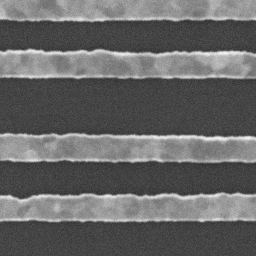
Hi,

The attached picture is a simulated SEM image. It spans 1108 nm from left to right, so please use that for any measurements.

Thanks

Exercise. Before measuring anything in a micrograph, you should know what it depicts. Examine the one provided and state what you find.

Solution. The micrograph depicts lines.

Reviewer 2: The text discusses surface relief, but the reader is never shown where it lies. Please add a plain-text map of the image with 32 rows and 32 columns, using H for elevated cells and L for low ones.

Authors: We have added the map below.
HHHHHHHHHHHHHHHHHHHHHHHHHHHHHHHH
HHHHHHHHHHHHHHHHHHHHHHHHHHHHHHHH
LLHHHLHHHHHHHLLLLLLLLHHLLLLLLLLL
LLLLLLLLLLLLLLLLLLLLLLLLLLLLLLLL
LLLLLLLLLLLLLLLLLLLLLLLLLLLLLLLL
LLLLLLLLLLLLLLLLLLLLLLLLLLLLLLLL
LHLHHHLLLLHHHHLLLLLLLLLLLLLLLLLL
HHHHHHHHHHHHHHHHHHHHHHHHHHHHHHHH
HHHHHHHHHHHHHHHHHHHHHHHHHHHHHHHH
HHHHHHHHHHHHHHHHHHHHHHHHHHHHHHHH
LLLLLLLLLLLLLLLLLLLLLLLLLLLLLLLL
LLLLLLLLLLLLLLLLLLLLLLLLLLLLLLLL
LLLLLLLLLLLLLLLLLLLLLLLLLLLLLLLL
LLLLLLLLLLLLLLLLLLLLLLLLLLLLLLLL
LLLLLLLLLLLLLLLLLLLLLLLLLLLLLLLL
LLLLLLLLLLLLLLLLLLLLLLLLLLLLLLLL
LLLLLLLLLLLLLLLLLLLLLLLLLLLLLLLL
HHHHHHHHHHHHHHHHHHHHHHHHHHHHHHHH
HHHHHHHHHHHHHHHHHHHHHHHHHHHHHHHH
HHHHHHHHHHHHHHHHHHHHHHHHHHHHHHHH
LLLLLLLLLLLLLLLLLLLLLLLLLLLLLLLL
LLLLLLLLLLLLLLLLLLLLLLLLLLLLLLLL
LLLLLLLLLLLLLLLLLLLLLLLLLLLLLLLL
LLLLLLLLLLLLLLLLLLLLLLLLLLLLLLLL
LLLLLHHLLLHHLLLHHLLLHHLLLHHHHHHH
HHHHHHHHHHHHHHHHHHHHHHHHHHHHHHHH
HHHHHHHHHHHHHHHHHHHHHHHHHHHHHHHH
HHHHHHHHHHHHHHHHHHHHHHHHHHHHHHHH
LLLLLLLLLLLLLLLLLLLLLLLLLLLLLLLL
LLLLLLLLLLLLLLLLLLLLLLLLLLLLLLLL
LLLLLLLLLLLLLLLLLLLLLLLLLLLLLLLL
LLLLLLLLLLLLLLLLLLLLLLLLLLLLLLLL